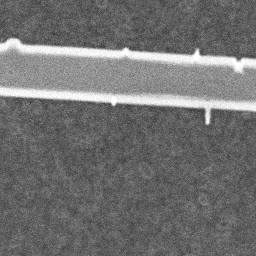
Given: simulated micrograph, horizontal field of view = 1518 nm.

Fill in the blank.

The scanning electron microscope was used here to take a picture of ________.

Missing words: one or a few lines or trenches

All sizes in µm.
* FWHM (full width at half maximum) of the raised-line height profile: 0.274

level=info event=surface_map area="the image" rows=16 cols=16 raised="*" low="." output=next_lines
................
................
................
**********......
****************
****************
............****
................
................
................
................
................
................
................
................
................